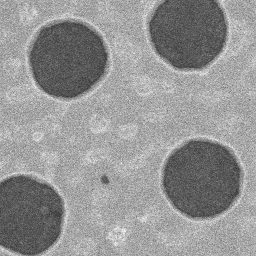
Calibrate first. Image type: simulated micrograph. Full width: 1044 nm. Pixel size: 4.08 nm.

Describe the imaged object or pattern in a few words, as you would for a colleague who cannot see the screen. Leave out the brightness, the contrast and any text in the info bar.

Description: holes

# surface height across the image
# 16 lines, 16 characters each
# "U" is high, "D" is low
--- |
UUUUUUUUUUDDDDUU
UUUDDUUUUDDDDDUU
UUDDDDUUUDDDDDUU
UUDDDDDUUUDDDDUU
UUDDDDDUUUUUUUUU
UUUDDDUUUUUUUUUU
UUUUUUUUUUUUUUUU
UUUUUUUUUUUUUUUU
UUUUUUUUUUUUUUUU
UUUUUUUUUUUDDDUU
UUUUUUUUUUDDDDDU
DDDUUUUUUUDDDDDU
DDDDUUUUUUUDDDDU
DDDDUUUUUUUUDDUU
DDDDUUUUUUUUUUUU
DDDUUUUUUUUUUUUU